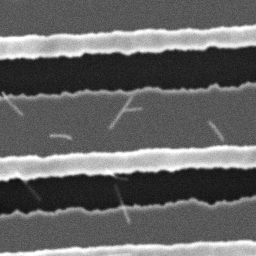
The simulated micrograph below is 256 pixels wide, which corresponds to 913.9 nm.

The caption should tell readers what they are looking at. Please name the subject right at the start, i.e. lines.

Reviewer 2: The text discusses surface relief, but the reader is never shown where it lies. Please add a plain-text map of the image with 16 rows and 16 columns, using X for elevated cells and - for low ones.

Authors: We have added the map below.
XXXXXXXXXXXXXXXX
XXXXXXXXXXXXXXXX
XXXXXXXXXXXXXXXX
XXXXX-----------
----------------
-------------XXX
XXXXXXXXXXXXXXXX
XXXXXXXXXXXXXXXX
XXXXXXXXXXXXXXXX
XXXXXXXXXXXXXXXX
XXXXXXXXXXXX----
----------------
---------------X
XXXXXXXXXXXXXXXX
XXXXXXXXXXXXXXXX
XXXXXXXXXXXXXXXX